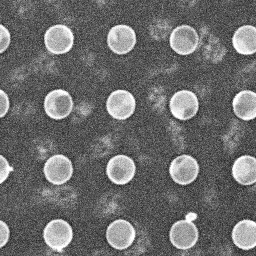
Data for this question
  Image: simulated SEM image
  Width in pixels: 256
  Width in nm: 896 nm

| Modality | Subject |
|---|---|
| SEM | a regular array of raised bodies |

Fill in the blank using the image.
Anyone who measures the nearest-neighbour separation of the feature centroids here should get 0.219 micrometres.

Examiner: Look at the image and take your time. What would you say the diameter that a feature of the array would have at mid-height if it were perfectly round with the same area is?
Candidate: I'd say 98.4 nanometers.